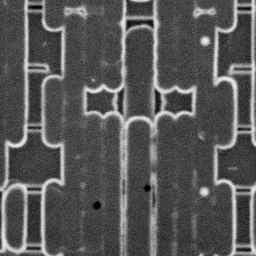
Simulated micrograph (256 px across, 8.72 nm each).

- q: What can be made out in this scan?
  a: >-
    wiring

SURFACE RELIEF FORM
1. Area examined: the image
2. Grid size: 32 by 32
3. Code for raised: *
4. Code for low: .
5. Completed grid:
***..***********...***********..
***..***********...**********...
***..***********...**********...
***...**********...**********...
***.....********...********.....
***.....*******....********.....
***.....*******....********.....
***.....*******....********.....
***.....*******....********.....
***...*********....********.....
***..**********....**********...
***..******.............*****...
***..******.............*****...
***..******.............******..
***..**********.....**********..
***..************************...
***..************************...
***..************************...
*.......********************....
*.......*******************.....
*.......*******************.....
*.......*******************.....
*.......*******************.....
***..************************...
***..************************..*
***..************************..*
***..************************..*
***..************************..*
***..************************..*
***..************************..*
.**..************************..*
......***********************...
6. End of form